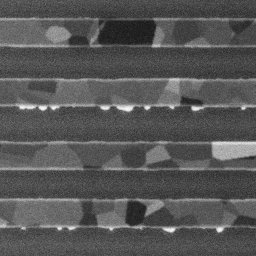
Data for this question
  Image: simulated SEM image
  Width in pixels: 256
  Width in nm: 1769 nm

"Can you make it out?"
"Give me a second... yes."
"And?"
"lines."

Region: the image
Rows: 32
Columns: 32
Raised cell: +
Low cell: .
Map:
................................
................................
++++++++++++++++++++++++++++++++
++++++++++++++++++++++++++++++++
++++++++++++++++++++++++++++++++
++++++++++++++++++++++++++++++++
................................
................................
................................
................................
++++++++++++++++++++++++++++++++
++++++++++++++++++++++++++++++++
++++++++++++++++++++++++++++++++
................................
................................
................................
................................
................................
++++++++++++++++++++++++++++++++
++++++++++++++++++++++++++++++++
++++++++++++++++++++++++++++++++
................................
................................
................................
................................
++++++++++++++++++++++++++++++++
++++++++++++++++++++++++++++++++
++++++++++++++++++++++++++++++++
................................
................................
................................
................................